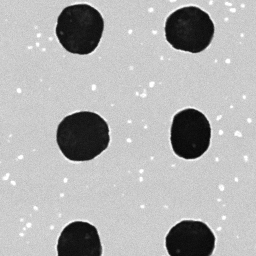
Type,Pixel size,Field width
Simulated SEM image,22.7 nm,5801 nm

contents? holes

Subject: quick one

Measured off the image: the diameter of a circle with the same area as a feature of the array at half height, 1.11 microns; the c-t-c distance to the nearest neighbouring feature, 2400 nanometers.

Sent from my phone